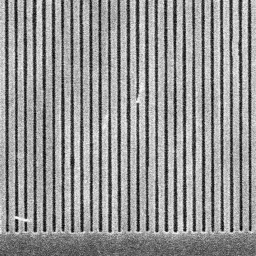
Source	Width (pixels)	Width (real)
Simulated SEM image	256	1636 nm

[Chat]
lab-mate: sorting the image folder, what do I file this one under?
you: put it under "parallel lines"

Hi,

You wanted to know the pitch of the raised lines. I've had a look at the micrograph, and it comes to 59.6 nm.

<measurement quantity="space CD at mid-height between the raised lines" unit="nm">24.7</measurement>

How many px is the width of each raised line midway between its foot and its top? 5.74